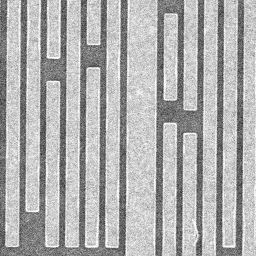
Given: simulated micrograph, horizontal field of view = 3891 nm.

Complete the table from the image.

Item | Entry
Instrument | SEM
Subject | groups of lines, slits or small figures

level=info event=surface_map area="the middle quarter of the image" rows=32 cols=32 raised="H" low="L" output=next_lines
LHHHLLLLLLLHHHLLHHHHHHHLLHHHLLHH
LHHHLLHHHLLHHHLLHHHHHHHLLHHHLLHH
LHHHLLHHHLLHHHLLHHHHHHHLLHHHLLHH
LHHHLLHHHLLHHHLLHHHHHHHLLHHHLLHH
LHHHLLHHHLLHHHLLHHHHHHHLLHHHLLHH
LHHHLLHHHLLHHHLLHHHHHHHLLHHHLLHH
LHHHLLHHHLLHHHLLHHHHHHHLLHHHLLHH
LHHHLLHHHLLHHHLLHHHHHHHLLHHHLLHH
LHHHLLHHHLLHHHLLHHHHHHHLLHHHLLHH
LHHHLLHHHLLHHHLLHHHHHHHLLLLLLLHH
LHHHLLHHHLLHHHLLHHHHHHHLLLLLLLHH
LHHHLLHHHLLHHHLLHHHHHHHLLLLLLLLL
LHHHLLHHHLLHHHLLHHHHHHHLLLLLLLLL
LHHHLLHHHLLHHHLLHHHHHHHLLLLLLLLL
LHHHLLHHHLLHHHLLHHHHHHHLLLLLLLLL
LHHHLLHHHLLHHHLLHHHHHHHLLHHHLLLL
LHHHLLHHHLLHHHLLHHHHHHHLLHHHLLLL
LHHHLLHHHLLHHHLLHHHHHHHLLHHHLLLL
LHHHLLHHHLLHHHLLHHHHHHHLLHHHLLHH
LHHHLLHHHLLHHHLLHHHHHHHLLHHHLLHH
LHHHLLHHHLLHHHLLHHHHHHHLLHHHLLHH
LHHHLLHHHLLHHHLLHHHHHHHLLHHHLLHH
LHHHLLHHHLLHHHLLHHHHHHHLLHHHLLHH
LHHHLLHHHLLHHHLLHHHHHHHLLHHHLLHH
LHHHLLHHHLLHHHLLHHHHHHHLLHHHLLHH
LHHHLLHHHLLHHHLLHHHHHHHLLHHHLLHH
LHHHLLHHHLLHHHLLHHHHHHHLLHHHLLHH
LHHHLLHHHLLHHHLLHHHHHHHLLHHHLLHH
LHHHLLHHHLLHHHLLHHHHHHHLLHHHLLHH
LHHHLLHHHLLHHHLLHHHHHHHLLHHHLLHH
LHHHLLHHHLLHHHLLHHHHHHHLLHHHLLHH
LHHHLLHHHLLHHHLLHHHHHHHLLHHHLLHH